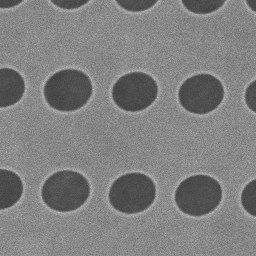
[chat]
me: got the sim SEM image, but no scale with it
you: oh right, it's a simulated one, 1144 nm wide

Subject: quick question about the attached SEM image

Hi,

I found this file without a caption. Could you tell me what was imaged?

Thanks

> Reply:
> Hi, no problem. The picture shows holes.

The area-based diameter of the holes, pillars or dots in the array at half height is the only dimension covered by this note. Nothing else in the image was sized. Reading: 195 nm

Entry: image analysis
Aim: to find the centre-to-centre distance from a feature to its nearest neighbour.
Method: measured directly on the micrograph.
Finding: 297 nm